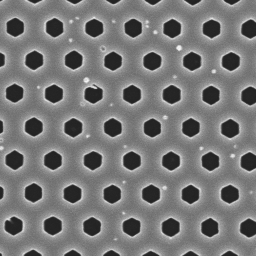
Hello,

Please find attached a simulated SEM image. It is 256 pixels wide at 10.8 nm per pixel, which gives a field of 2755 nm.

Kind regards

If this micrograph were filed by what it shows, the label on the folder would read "a regular array of holes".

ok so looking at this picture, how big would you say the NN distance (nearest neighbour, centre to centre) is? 410 nm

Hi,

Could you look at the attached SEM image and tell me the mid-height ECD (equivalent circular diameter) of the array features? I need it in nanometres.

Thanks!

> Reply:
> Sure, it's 196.